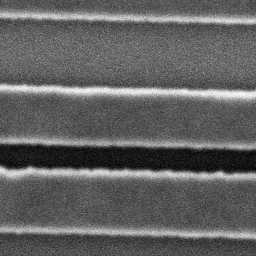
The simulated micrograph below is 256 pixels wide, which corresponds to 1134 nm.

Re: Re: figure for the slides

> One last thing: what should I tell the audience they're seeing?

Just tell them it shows lines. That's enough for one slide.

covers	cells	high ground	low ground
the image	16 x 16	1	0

1111111111111111
0000000000000000
0000000000000000
0000000000000000
0000000000000000
1111000000000000
1111111111111111
1111111111111111
1111111111111111
0000000000000000
0000000000000000
1111111111111111
1111111111111111
1111111111111111
0111111111111111
0000000000000000